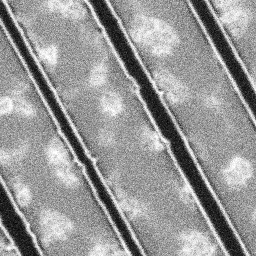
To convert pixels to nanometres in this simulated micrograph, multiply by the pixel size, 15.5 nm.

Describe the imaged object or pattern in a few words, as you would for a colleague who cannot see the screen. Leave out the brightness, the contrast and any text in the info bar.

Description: one or a few lines or trenches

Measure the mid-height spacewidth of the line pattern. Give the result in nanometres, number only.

1110